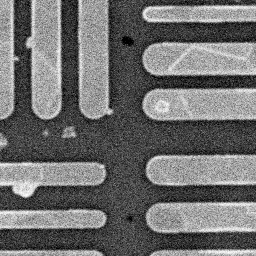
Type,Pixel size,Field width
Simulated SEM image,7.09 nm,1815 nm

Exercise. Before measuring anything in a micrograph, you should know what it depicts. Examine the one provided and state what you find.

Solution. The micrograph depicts groups of lines, slits or small figures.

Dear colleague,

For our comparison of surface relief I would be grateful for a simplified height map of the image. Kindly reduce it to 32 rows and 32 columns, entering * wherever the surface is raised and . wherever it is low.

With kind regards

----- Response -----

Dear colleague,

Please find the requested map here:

**..***...***...................
**..***...***.....**************
**..***...***.......************
**..***...***...................
**..***...***...................
**..***...***...................
**..***...***.....**************
**..***...***.....**************
**..***...***.....**************
**..***...***...................
**..****..***...................
**..****..***......*************
**..****..***.....**************
**..***...***.....**************
*....**....**......*************
................................
................................
................................
................................
................................
..**********.......*************
*************.....**************
*************......*************
..**............................
................................
....................*******...**
......******.......*************
*************.....**************
...................*************
................................
................................
************........********.***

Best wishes